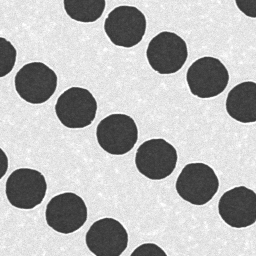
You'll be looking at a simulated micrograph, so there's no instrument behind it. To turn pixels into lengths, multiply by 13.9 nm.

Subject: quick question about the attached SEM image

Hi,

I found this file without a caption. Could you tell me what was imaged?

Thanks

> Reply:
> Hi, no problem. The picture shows a regular array of holes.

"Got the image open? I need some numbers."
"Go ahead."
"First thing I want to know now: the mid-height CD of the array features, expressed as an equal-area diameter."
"586 nanometers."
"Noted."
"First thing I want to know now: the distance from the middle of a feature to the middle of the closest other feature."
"661 nm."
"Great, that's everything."